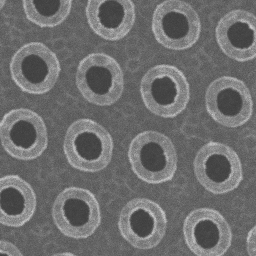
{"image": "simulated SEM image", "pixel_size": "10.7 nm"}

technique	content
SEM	a regular array of ring-shaped raised bodies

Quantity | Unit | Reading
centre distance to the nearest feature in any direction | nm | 706